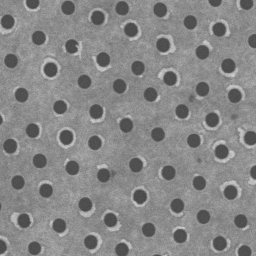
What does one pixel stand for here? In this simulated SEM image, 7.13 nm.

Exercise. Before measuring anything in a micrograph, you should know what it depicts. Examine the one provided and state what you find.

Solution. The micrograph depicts a regular array of holes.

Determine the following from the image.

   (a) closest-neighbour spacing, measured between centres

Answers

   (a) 212 nm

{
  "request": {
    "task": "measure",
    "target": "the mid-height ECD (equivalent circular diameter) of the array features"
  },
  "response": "0.101 um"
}